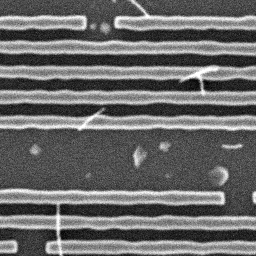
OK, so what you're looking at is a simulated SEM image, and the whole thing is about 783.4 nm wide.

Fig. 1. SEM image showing groups of lines, slits or small figures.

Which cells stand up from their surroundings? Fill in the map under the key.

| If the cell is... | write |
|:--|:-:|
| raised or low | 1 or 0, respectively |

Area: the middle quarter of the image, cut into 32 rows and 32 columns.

00000000000000000000000000000000
11111111111111111111111111111111
11111111111111111111111111111111
11000110001111100000011111111110
00000000000000000000000000000000
00000000000000000000000000000000
00000000000000000000000000000000
11111111111111111111111111111111
11111111111111111111111111111111
11111111111111111111111000111111
00000000000000000000000000000000
00000000000000000000000000000000
00000000000000000000000000000000
11000111111111111111111111011111
11111111111111111111111111111111
11111111111111111111111111111111
00000000000000000000000000000000
00000000000000000000000000000000
00000000000000000000000000000000
00000000000000000000000000000000
00000000000000000000000000000000
00000000000000000000000000000000
00000000000000000000000000000000
00000000000000000000000000000000
00000000000000000000000000000000
00000000000000000000000000000000
00000000000000000000000000000000
00000000000000000000000000000000
00000000000000000000000000000000
00000000000000000000000000000000
00000000000000000000000000000000
00000000000000000000000000000000